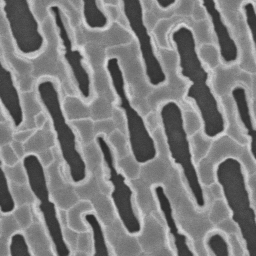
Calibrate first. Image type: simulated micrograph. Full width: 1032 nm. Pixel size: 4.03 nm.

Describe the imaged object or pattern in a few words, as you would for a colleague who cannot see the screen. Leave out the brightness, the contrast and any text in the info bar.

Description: holes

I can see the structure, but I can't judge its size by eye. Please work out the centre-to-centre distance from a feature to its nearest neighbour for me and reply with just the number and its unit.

279 nm